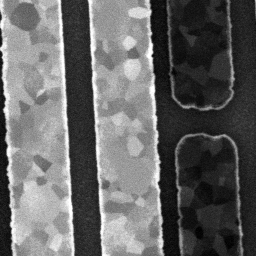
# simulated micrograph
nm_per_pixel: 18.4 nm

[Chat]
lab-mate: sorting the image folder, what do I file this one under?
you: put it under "one or a few lines or trenches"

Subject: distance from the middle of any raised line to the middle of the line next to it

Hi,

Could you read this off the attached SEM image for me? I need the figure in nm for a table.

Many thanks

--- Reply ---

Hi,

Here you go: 1550